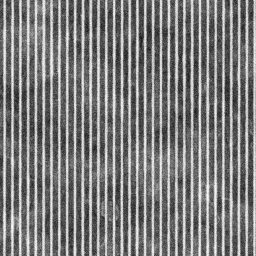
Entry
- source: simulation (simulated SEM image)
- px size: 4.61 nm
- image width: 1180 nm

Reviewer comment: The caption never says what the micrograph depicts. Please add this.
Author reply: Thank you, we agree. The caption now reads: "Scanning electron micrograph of parallel lines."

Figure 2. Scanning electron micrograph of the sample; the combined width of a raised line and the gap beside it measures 7.81 px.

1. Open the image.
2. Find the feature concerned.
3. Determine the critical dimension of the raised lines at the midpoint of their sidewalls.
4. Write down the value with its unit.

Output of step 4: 1.87 pixels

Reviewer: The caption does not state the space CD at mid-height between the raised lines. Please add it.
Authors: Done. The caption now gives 27.7 nm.